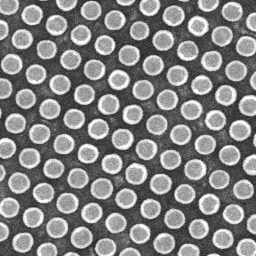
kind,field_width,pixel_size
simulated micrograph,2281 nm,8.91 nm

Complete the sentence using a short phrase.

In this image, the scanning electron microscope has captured a regular array of raised bodies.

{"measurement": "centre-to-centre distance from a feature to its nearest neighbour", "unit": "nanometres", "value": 232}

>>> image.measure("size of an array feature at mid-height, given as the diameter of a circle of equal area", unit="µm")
0.169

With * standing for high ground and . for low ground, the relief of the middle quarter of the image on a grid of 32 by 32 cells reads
***..*****..........*****.......
.....*****..........****..****..
.....*****..***......**...*****.
*......**..*****..........*****.
*..........*****...**......***..
*...**......***...****..........
*..****..........*****..........
...****...........****..****....
...****...***......**..*****....
....***..*****.........*****...*
.........*****...*......****..**
..*......****..****..........***
.****..........****...........**
*****..........****...***......*
*****..***......**...*****......
.***..*****..........*****...*..
......*****..........****..****.
.......****.*****..........****.
**......*...*****..........****.
**..........*****..***......***.
**...**......***..*****.........
**..****..........*****.........
....****...........***...***....
....****..****......**..*****...
.....**...****..........*****..*
..........****...**......***..**
..***.....****..****..........**
..****..........*****..........*
.*****..........****..****......
.*****..***......***..*****.....
..***..*****..........****...**.
.......*****...*......****..****